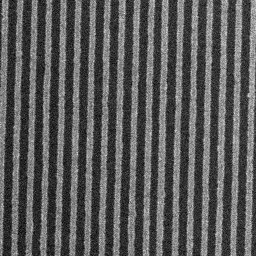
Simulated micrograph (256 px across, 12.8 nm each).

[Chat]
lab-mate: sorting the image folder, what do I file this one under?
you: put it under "parallel lines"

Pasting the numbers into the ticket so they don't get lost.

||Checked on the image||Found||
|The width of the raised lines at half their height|0.0655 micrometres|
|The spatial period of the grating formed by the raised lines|0.187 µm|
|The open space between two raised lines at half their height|9.25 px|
